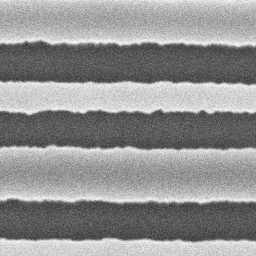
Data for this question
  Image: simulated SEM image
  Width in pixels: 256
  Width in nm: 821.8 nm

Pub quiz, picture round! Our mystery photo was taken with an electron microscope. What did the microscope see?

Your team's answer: lines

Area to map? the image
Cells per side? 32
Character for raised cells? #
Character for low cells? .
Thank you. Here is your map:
################################
################################
################################
################################
################################
.........................#..####
................................
................................
................................
................................
############.#####.#####.##.....
################################
################################
################################
................................
................................
................................
................................
#####.####......#...............
################################
################################
################################
################################
################################
################################
................................
................................
................................
................................
................................
################################
################################